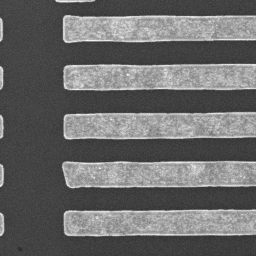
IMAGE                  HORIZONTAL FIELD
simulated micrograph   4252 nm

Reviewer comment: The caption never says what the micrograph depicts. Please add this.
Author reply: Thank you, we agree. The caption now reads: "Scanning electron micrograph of wiring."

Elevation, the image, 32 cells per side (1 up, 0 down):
00000000000000000000000000000000
00000000000000000000000000000000
00000000111111111111111111111111
00000000111111111111111111111111
00000000111111111111111111111111
00000000000000000000000000000000
00000000000000000000000000000000
00000000000000000000000000000000
00000000111111111111111111111111
00000000111111111111111111111111
00000000111111111111111111111111
00000000000000000000000000000000
00000000000000000000000000000000
00000000000000000000000000000000
00000000111111111111111111111111
00000000111111111111111111111111
00000000111111111111111111111111
00000000000000000000000000000000
00000000000000000000000000000000
00000000000000000000000000000000
00000000111111111111111111111111
00000000111111111111111111111111
00000000111111111111111111111111
00000000000000000000000000000000
00000000000000000000000000000000
00000000000000000000000000000000
00000000111111111111111111111111
00000000111111111111111111111111
00000000111111111111111111111111
00000000000000000000000000000000
00000000000000000000000000000000
00000000000000000000000000000000